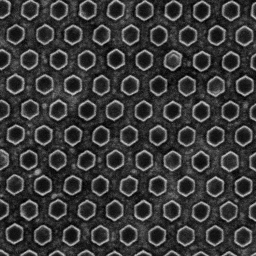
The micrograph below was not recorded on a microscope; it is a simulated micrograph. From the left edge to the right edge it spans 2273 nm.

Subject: a regular array of raised bodies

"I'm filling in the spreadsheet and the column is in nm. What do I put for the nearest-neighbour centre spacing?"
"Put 250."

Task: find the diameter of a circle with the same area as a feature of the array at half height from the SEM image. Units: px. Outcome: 17.4